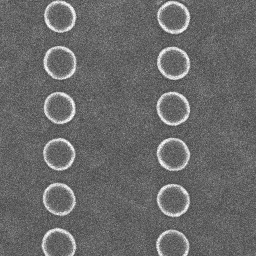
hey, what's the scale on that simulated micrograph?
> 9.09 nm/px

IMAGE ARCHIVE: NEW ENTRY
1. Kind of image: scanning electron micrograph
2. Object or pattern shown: a regular array of raised bodies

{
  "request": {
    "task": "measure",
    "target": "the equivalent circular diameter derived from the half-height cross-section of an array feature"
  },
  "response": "0.285 micrometres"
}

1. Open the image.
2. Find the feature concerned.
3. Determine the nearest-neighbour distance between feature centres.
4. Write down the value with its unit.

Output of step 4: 414 nanometers